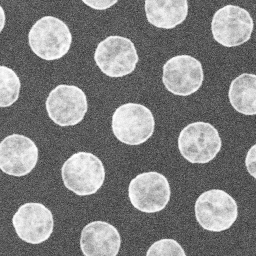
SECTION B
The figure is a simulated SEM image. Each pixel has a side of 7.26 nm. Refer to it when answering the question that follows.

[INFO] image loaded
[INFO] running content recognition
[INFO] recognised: a regular array of raised bodies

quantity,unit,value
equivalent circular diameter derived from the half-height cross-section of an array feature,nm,294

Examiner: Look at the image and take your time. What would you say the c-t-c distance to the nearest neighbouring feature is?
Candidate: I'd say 500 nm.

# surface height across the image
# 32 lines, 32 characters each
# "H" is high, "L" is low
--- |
LLLLLLLLLLLHHHLLLLHHHHHLLLLLLLLL
LLLLLLLLLLLLLLLLLLHHHHHLLLLHHHHL
LLLLLHHLLLLLLLLLLLLHHHHLLLLHHHHL
LLLLHHHHLLLLLLLLLLLLLLLLLLLHHHHL
LLLLHHHHHLLLLLLLLLLLLLLLLLLHHHHL
LLLLHHHHHLLLLHHHLLLLLLLLLLLLHHLL
LLLLHHHHLLLLHHHHHLLLLLLLLLLLLLLL
LLLLLLLLLLLLHHHHHLLLLHHHLLLLLLLL
HLLLLLLLLLLLLHHHHLLLLHHHHLLLLLLL
HHLLLLLLLLLLLLHLLLLLHHHHHLLLLLHH
HHLLLLLLLLLLLLLLLLLLLHHHHLLLLHHH
HHLLLLLHHHLLLLLLLLLLLLHHLLLLLHHH
HHLLLLHHHHHLLLLLLLLLLLLLLLLLLHHH
LLLLLLHHHHHLLLLHHHLLLLLLLLLLLHHH
LLLLLLHHHHLLLLHHHHHLLLLLLLLLLLLL
LLLLLLLHHLLLLLHHHHHLLLLLHHLLLLLL
LLLLLLLLLLLLLLHHHHHLLLLHHHHLLLLL
LHHHLLLLLLLLLLLHHHLLLLHHHHHLLLLL
HHHHLLLLLLLLLLLLLLLLLLHHHHHLLLLL
HHHHHLLLLHHHLLLLLLLLLLLHHHHLLLLH
HHHHLLLLHHHHHLLLLLLLLLLLLLLLLLLH
LHHLLLLLHHHHHLLLLLLLLLLLLLLLLLLH
LLLLLLLLHHHHHLLLLHHHHLLLLLLLLLLL
LLLLLLLLLHHHLLLLHHHHHLLLLLLLLLLL
LLLLLLLLLLLLLLLLHHHHHLLLLHHHHLLL
LLLLHLLLLLLLLLLLLHHHHLLLLHHHHLLL
LLHHHHLLLLLLLLLLLLLLLLLLLHHHHHLL
LLHHHHHLLLLLLLLLLLLLLLLLLHHHHLLL
LLHHHHHLLLLHHHLLLLLLLLLLLLHHLLLL
LLHHHHLLLLHHHHHLLLLLLLLLLLLLLLLL
LLLLLLLLLLHHHHHLLLLHHHLLLLLLLLLL
LLLLLLLLLLHHHHHLLLLHHHHLLLLLLLLL